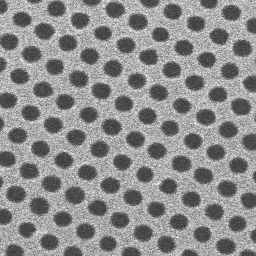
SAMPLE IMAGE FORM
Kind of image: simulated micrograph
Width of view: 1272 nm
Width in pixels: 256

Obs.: a regular array of holes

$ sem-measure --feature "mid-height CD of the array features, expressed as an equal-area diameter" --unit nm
85.6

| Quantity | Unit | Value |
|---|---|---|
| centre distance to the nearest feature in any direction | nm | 127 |